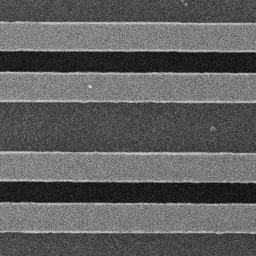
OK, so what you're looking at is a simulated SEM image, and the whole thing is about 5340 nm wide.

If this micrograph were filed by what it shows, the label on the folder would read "lines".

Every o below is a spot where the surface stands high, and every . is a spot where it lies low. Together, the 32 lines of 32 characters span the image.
................................
................................
................................
oooooooooooooooooooooooooooooooo
oooooooooooooooooooooooooooooooo
oooooooooooooooooooooooooooooooo
................................
................................
................................
oooooooooooooooooooooooooooooooo
oooooooooooooooooooooooooooooooo
oooooooooooooooooooooooooooooooo
oooooooooooooooooooooooooooooooo
................................
................................
................................
................................
................................
................................
oooooooooooooooooooooooooooooooo
oooooooooooooooooooooooooooooooo
oooooooooooooooooooooooooooooooo
oooooooooooooooooooooooooooooooo
................................
................................
oooooooooooooooooooooooooo.oooo.
oooooooooooooooooooooooooooooooo
oooooooooooooooooooooooooooooooo
oooooooooooooooooooooooooooooooo
................................
................................
................................